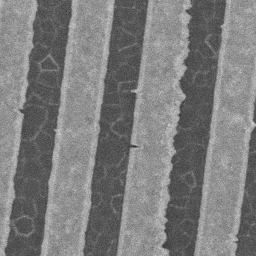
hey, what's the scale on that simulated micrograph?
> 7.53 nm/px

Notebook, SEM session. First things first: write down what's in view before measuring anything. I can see one or a few lines or trenches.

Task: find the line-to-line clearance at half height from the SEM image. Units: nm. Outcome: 291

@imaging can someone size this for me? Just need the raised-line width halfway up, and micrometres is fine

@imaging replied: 0.277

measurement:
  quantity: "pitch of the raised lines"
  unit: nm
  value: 571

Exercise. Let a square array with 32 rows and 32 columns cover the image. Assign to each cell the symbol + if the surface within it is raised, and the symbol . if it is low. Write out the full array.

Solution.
++++.....+++++.....+++++.....+++
++++.....+++++.....++++.....++++
++++.....+++++.....++++.....++++
++++.....+++++....+++++.....++++
++++.....++++.....+++++.....++++
++++.....++++.....+++++.....++++
++++.....++++.....+++++.....++++
+++.....+++++.....+++++.....++++
+++.....+++++.....+++++.....++++
+++.....+++++.....+++++....+++++
+++.....+++++.....++++.....+++++
+++.....+++++....++++++....+++++
+++.....+++++....++++++....+++++
++......++++.....+++++.....++++.
+++.....++++.....+++++.....++++.
++......++++.....+++++.....+++++
++.....+++++.....++++......++++.
++.....+++++.....++++......++++.
++.....+++++.....++++.....+++++.
++.....+++++.....++++.....+++++.
++.....+++++....+++++.....+++++.
++.....++++.....+++++.....++++..
+......++++.....+++++.....++++..
+.....+++++.....+++++.....++++..
+.....+++++.....+++++.....++++..
+.....+++++.....++++.....+++++..
+.....+++++.....++++.....+++++..
+.....+++++....+++++.....+++++..
+.....+++++....+++++.....+++++..
+.....++++.....++++++....++++...
......++++.....+++++.....++++...
.....+++++.....++++++....++++...